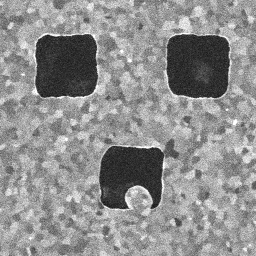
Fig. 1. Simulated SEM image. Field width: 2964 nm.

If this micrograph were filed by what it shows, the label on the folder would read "holes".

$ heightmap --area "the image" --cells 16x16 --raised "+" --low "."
++++++++++++++++
++++++++++++++++
++....+++++...++
++....++++....++
++....++++....++
++....+++++...++
++++++++++++++++
++++++++++++++++
++++++++++++++++
+++++++...++++++
++++++....++++++
++++++....++++++
++++++..+.++++++
++++++++++++++++
++++++++++++++++
++++++++++++++++